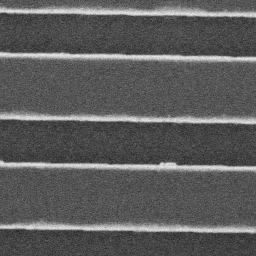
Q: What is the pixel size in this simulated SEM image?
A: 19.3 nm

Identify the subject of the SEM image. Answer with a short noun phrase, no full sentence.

lines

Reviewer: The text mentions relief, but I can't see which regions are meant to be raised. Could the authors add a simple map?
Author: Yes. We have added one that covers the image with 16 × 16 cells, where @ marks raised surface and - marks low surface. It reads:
@@@@@@@@@@@@@@@@
----------------
----------------
@@@@@@@@--------
@@@@@@@@@@@@@@@@
@@@@@@@@@@@@@@@@
@@@@@@@@@@@@@@@@
--------@@@@@@@@
----------------
----------------
@@@@@@@@@@@@@@@-
@@@@@@@@@@@@@@@@
@@@@@@@@@@@@@@@@
@@@@@@@@@@@@@@@@
----------------
----------------